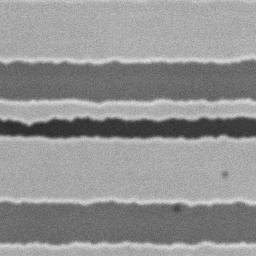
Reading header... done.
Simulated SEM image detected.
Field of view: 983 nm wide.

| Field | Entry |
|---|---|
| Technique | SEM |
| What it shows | lines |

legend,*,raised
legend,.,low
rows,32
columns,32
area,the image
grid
********************************
********************************
********************************
********************************
********************************
********************************
********************************
******************************..
................................
................................
................................
................................
........*...........*.........*.
********************************
********************************
...*............................
................................
********************************
********************************
********************************
********************************
********************************
********************************
********************************
********************************
.......................**......*
................................
................................
................................
................................
....*....**.*..**.*......**...*.
********************************